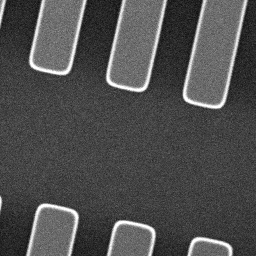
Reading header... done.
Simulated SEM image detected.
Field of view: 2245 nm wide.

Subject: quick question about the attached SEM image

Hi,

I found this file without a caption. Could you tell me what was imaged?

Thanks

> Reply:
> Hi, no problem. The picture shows groups of lines, slits or small figures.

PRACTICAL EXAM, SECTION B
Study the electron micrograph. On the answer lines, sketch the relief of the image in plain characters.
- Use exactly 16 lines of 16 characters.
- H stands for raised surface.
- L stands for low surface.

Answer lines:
LLLHHLLLHHLLLHHL
LLHHHLLHHHLLHHHL
LLHHHLLHHHLLHHHL
LLHHHLLHHHLLHHHL
LLLHLLLHHLLLHHLL
LLLLLLLLHLLLHHLL
LLLLLLLLLLLLHHLL
LLLLLLLLLLLLLLLL
LLLLLLLLLLLLLLLL
LLLLLLLLLLLLLLLL
LLLLLLLLLLLLLLLL
LLLLLLLLLLLLLLLL
LLLLLLLLLLLLLLLL
LLHHHLLLLLLLLLLL
LLHHHLLHHLLLLLLL
LLHHLLLHHHLLHHLL